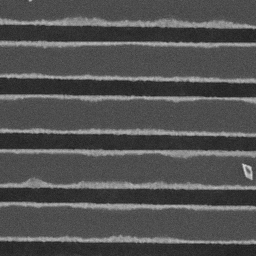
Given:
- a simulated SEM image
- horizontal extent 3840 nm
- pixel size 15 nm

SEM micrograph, lines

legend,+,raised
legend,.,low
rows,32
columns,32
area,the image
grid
++++++++++++++++++++++++++++++++
++++++++++++++++++++++++++++++++
++++++++++++++++++++++++++++++++
................................
................................
+++++++++++++++++++++++++..+++..
++++++++++++++++++++++++++++++++
++++++++++++++++++++++++++++++++
++++++++++++++++++++++++++++++++
++++++++++++++++++++++++++++++++
................................
................................
++++++++++++++++++++++++++++++++
++++++++++++++++++++++++++++++++
++++++++++++++++++++++++++++++++
++++++++++++++++++++++++++++++++
..+.++++++++++++++++++++++++++++
................................
................................
++++++++++++++++++++++++++++++++
++++++++++++++++++++++++++++++++
++++++++++++++++++++++++++++++++
++++++++++++++++++++++++++++++++
................++....++++++++++
................................
++++++++........................
++++++++++++++++++++++++++++++++
++++++++++++++++++++++++++++++++
++++++++++++++++++++++++++++++++
++++++++++++++++++++++++++++++++
................................
................................